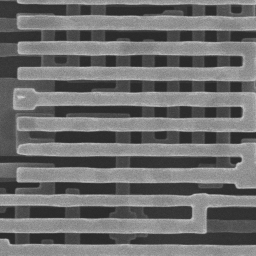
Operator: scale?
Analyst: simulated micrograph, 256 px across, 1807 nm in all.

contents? wiring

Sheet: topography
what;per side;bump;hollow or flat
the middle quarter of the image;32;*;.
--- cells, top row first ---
****..*****..****..****...***...
********************************
********************************
********************************
.............****..****...***...
.............****...**....***...
.......**********...**....***...
********************************
********************************
********************************
...................**********...
....................**....***...
.**************.....**....***...
*****************..****..****...
********************************
********************************
********************************
.............****..***....***...
.............****..****...***...
.............****..**********...
********************************
********************************
********************************
.............***................
.............***................
.............***................
********************************
********************************
********************************
.......****.***************.....
.............***................
.***.........***................